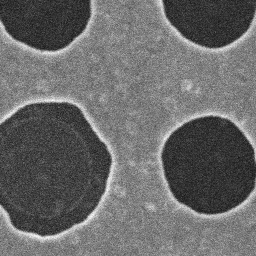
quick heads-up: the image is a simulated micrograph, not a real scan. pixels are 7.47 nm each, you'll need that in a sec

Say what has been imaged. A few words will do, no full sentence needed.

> holes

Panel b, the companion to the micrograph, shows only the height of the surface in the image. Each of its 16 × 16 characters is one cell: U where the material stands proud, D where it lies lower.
DDDDDDUUUUDDDDDD
DDDDDUUUUUUDDDDD
UDDDDUUUUUUUDDDU
UUUUUUUUUUUUUUUU
UUUUUUUUUUUUUUUU
UUUUUUUUUUUUUUUU
UUDDDUUUUUUUUUUU
DDDDDUUUUUUUDDUU
DDDDDDUUUUUDDDDU
DDDDDDDUUUDDDDDD
DDDDDDDUUUDDDDDD
DDDDDDDUUUDDDDDD
DDDDDDUUUUUDDDDU
DDDDDDUUUUUUUUUU
UUDDUUUUUUUUUUUU
UUUUUUUUUUUUUUUU